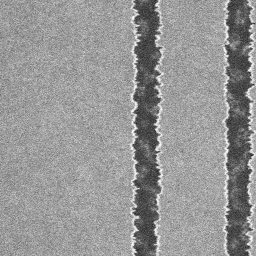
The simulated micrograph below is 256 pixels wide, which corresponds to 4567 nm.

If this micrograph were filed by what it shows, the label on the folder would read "one or a few lines or trenches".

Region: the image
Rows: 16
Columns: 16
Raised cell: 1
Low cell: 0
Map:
1111111100111100
1111111100111100
1111111110111100
1111111100111100
1111111100111100
1111111100111100
1111111100111100
1111111100111100
1111111100111100
1111111100111100
1111111100111100
1111111100111100
1111111100111100
1111111100111100
1111111100111100
1111111100111100